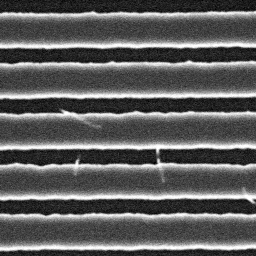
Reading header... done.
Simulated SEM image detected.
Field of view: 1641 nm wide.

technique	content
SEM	lines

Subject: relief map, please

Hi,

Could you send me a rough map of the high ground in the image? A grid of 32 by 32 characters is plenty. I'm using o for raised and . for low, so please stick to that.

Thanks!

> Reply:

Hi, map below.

................................
................................
oooooooooooooooooooooooooooooooo
oooooooooooooooooooooooooooooooo
oooooooooooooooooooooooooooooooo
oooooooooooooooooooooooooooooooo
................................
................................
oooooooooooooooooooooooooooooooo
oooooooooooooooooooooooooooooooo
oooooooooooooooooooooooooooooooo
oooooooooooooooooooooooooooooooo
................................
................................
oooooooooooooooooooooooooooooooo
oooooooooooooooooooooooooooooooo
oooooooooooooooooooooooooooooooo
oooooooooooooooooooooooooooooooo
oooo........o....o.o............
................................
..o......o.........ooo..........
oooooooooooooooooooooooooooooooo
oooooooooooooooooooooooooooooooo
oooooooooooooooooooooooooooooooo
oooooooooooooooooooooooooooooooo
................................
................................
oooooooooooooooooooooooooooooooo
oooooooooooooooooooooooooooooooo
oooooooooooooooooooooooooooooooo
oooooooooooooooooooooooooooooooo
................................